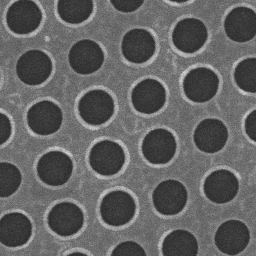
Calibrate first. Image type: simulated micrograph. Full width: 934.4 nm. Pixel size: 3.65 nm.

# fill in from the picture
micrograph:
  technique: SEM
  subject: a regular array of holes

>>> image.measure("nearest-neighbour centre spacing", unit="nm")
188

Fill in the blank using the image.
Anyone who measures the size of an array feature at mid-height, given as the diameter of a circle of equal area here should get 0.131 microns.